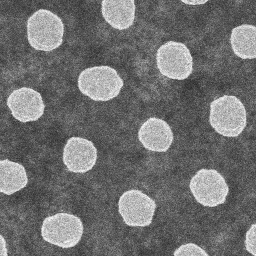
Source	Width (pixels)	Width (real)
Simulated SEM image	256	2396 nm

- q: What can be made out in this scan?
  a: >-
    a regular array of raised bodies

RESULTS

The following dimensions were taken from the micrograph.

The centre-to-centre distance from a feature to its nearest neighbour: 0.7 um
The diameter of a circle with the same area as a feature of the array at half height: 0.341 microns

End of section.